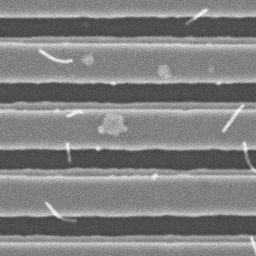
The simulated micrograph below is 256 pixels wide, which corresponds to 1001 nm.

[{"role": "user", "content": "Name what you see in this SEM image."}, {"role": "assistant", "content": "lines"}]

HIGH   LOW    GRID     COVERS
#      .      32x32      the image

################################
################################
................................
................................
................................
################################
################################
################################
################################
################################
.............##.................
................................
................................
################################
################################
################################
################################
################################
################################
................................
................................
################################
################################
################################
################################
################################
################################
................................
................................
.....................#........#.
################################
################################